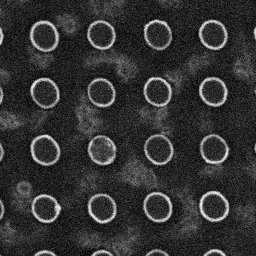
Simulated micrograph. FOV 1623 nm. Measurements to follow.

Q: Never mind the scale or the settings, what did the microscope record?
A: a regular array of raised bodies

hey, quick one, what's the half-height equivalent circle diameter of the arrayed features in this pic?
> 177 nm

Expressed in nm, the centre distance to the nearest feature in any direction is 354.